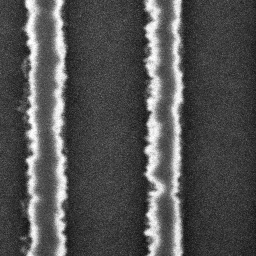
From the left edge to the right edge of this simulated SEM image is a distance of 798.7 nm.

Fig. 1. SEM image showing one or a few lines or trenches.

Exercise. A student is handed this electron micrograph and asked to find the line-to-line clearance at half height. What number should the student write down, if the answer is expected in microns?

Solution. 0.282